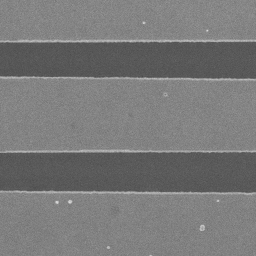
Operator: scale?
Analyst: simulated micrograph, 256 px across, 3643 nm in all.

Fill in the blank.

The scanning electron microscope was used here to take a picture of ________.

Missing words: lines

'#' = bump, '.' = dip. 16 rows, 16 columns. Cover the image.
################
################
################
................
................
################
################
################
################
#####.########.#
................
................
################
################
################
################